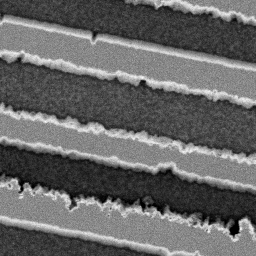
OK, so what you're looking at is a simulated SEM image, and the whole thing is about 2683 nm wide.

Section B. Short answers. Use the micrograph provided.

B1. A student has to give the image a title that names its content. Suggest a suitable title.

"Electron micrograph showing one or a few lines or trenches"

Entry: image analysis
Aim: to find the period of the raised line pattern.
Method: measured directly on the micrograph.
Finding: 872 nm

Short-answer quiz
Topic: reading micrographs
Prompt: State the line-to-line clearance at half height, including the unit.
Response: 461 nanometers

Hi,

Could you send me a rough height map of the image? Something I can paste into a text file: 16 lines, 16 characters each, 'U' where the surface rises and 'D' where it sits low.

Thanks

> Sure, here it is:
DDDDDDDDDDDUUUUU
UUDDDDDDDDDDDDDD
UUUUUUUDDDDDDDDD
UUUUUUUUUUUUUDDD
DDDDDUUUUUUUUUUU
DDDDDDDDDDDUUUUU
DDDDDDDDDDDDDDDU
UUUUDDDDDDDDDDDD
UUUUUUUUUDDDDDDD
DDDUUUUUUUUUUDDD
DDDDDDDDUUUUUUUU
UDDDDDDDDDDDDDUU
UUUUUUDDDDDDDDDD
UUUUUUUUUUUDDDDD
DDDDUUUUUUUUUUUU
DDDDDDDDDUUUUUUU